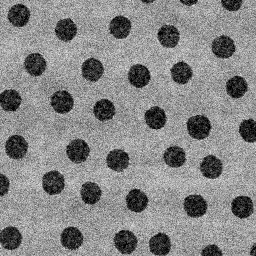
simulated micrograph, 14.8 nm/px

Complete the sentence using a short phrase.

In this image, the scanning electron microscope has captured a regular array of raised bodies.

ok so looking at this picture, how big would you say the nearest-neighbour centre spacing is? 622 nm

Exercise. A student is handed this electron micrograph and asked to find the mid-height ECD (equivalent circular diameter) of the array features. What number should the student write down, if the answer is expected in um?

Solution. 0.358